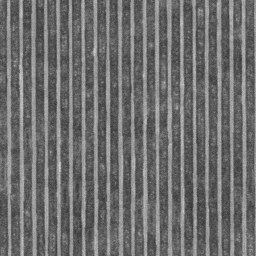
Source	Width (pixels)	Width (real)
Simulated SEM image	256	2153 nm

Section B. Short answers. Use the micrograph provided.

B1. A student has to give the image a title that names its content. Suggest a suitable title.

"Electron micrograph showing parallel lines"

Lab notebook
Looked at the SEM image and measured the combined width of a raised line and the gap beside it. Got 104 nm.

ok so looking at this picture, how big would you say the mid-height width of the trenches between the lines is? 81 nanometers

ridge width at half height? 24.2 nm